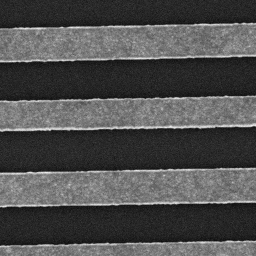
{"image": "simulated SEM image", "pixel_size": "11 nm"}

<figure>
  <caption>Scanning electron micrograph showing lines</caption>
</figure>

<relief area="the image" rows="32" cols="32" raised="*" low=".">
................................
................................
................................
.......*************************
********************************
********************************
********************************
**********......................
................................
................................
................................
................................
.......*************************
********************************
********************************
********************************
................................
................................
................................
................................
................................
.........***********************
********************************
********************************
********************************
***************..*..............
................................
................................
................................
................................
...............*****************
********************************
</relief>